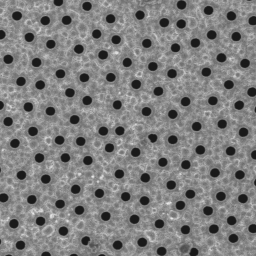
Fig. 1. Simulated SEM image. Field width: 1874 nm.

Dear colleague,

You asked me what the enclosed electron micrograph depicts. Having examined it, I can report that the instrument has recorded a regular array of holes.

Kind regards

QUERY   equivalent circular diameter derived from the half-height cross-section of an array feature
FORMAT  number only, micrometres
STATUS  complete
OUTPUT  0.0701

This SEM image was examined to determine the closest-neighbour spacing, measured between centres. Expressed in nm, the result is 159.